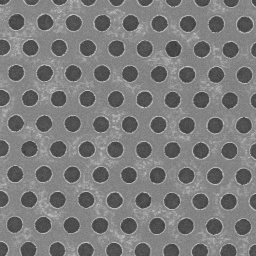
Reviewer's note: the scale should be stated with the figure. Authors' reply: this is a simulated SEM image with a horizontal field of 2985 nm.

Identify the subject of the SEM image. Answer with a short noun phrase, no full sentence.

a regular array of holes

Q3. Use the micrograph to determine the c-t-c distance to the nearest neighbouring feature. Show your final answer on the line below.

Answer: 331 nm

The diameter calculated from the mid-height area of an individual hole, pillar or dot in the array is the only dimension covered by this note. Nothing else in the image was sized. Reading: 195 nanometers